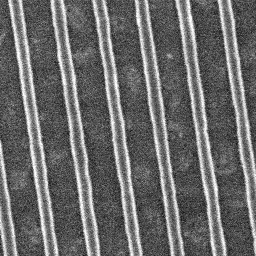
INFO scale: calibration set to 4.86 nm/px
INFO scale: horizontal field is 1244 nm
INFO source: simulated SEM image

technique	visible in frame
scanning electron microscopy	parallel lines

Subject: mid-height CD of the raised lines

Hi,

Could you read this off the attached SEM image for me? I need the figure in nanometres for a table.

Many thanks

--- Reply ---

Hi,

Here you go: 60.1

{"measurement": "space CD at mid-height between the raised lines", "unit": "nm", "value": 142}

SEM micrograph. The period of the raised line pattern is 201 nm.